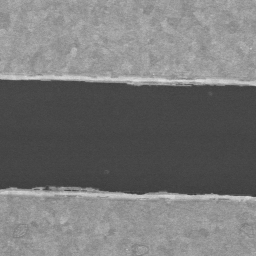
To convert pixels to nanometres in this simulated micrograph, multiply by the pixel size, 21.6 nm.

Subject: one or a few lines or trenches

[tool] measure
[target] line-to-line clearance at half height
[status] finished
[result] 2510 nm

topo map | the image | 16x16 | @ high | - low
@@@@@@@@@@@@@@@@
@@@@@@@@@@@@@@@@
@@@@@@@@@@@@@@@@
@@@@@@@@@@@@@@@@
@@@@@@@@@@@@@@@@
----------------
----------------
----------------
----------------
----------------
----------------
----------------
@@@@@@@@@@@@@@@@
@@@@@@@@@@@@@@@@
@@@@@@@@@@@@@@@@
@@@@@@@@@@@@@@@@